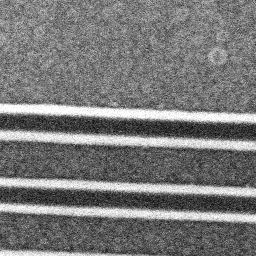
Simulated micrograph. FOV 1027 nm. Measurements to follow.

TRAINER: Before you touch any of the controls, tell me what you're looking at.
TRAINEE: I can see one or a few lines or trenches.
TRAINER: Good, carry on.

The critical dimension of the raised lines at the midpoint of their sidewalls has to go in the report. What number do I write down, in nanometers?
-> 115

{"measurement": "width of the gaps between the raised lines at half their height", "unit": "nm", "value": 176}